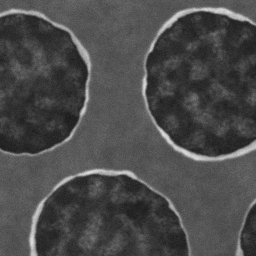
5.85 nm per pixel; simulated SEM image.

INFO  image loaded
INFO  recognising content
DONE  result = holes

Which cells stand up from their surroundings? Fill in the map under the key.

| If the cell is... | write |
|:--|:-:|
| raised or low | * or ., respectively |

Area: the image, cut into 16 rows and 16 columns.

****************
...********.....
.....*****......
.....****.......
.....****.......
.....****.......
.....****.......
.....*****......
....******......
...*********...*
****************
****.....*******
***.......******
**.........****.
**..........***.
**..........***.